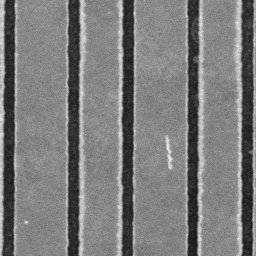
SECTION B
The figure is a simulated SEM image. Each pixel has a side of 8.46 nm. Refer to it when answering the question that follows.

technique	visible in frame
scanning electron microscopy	lines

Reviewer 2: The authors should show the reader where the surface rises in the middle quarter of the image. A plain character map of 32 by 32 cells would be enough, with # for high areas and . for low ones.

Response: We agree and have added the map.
#...###########...#############.
#...###########...#############.
#...###########...#############.
#...###########...#############.
#...###########...#############.
#...###########...#############.
#...###########...#############.
#...###########...#############.
#...###########...#############.
#...###########...#############.
#...###########...#############.
#...###########...#############.
#...###########...#############.
#...##########....#############.
#...##########....#############.
#...###########...#############.
#...###########...#############.
#...###########...#############.
#...###########...#############.
#...###########...#############.
#...###########...#############.
#...###########...#############.
#...###########..##############.
#...###########..##############.
#...###########..##############.
#...###########..##############.
#...###########..##############.
#...##########...##############.
#...##########...##############.
#...##########...##############.
#...###########..##############.
#...###########...#############.